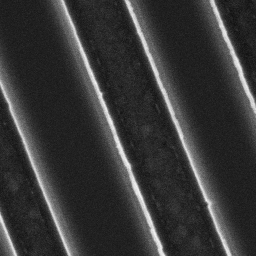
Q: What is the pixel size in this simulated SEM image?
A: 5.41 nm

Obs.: one or a few lines or trenches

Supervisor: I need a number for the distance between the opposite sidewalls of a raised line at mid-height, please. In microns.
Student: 0.479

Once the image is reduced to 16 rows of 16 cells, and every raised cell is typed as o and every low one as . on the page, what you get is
oooo....oooooo..
ooooo...oooooo..
ooooo....ooooo..
ooooo....oooooo.
oooooo....ooooo.
oooooo....ooooo.
.oooooo...oooooo
.oooooo....ooooo
.oooooo....ooooo
..oooooo....oooo
..oooooo....oooo
..oooooo....oooo
...oooooo....ooo
...oooooo....ooo
....oooooo....oo
o...oooooo....oo